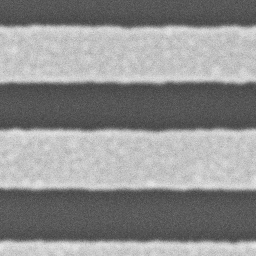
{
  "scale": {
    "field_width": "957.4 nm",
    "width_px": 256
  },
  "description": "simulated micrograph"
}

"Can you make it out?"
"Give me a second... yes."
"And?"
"lines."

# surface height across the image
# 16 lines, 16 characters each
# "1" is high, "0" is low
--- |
0000000000000000
0000000000000000
1111111111111111
1111111111111111
1111111111111111
0000000000000000
0000000000000000
0000000000000000
1111111111111111
1111111111111111
1111111111111111
1111111111111111
0000000000000000
0000000000000000
0000000000000000
1111111111111111